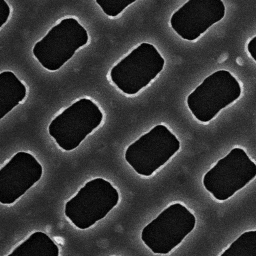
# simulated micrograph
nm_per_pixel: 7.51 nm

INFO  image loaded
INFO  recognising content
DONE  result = holes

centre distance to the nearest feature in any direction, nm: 606